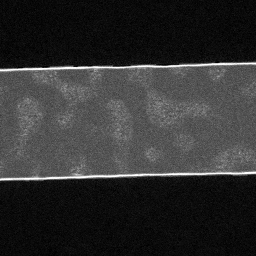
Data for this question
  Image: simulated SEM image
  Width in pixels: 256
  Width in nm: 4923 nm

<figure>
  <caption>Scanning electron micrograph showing one or a few lines or trenches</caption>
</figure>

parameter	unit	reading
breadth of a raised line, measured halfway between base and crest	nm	2110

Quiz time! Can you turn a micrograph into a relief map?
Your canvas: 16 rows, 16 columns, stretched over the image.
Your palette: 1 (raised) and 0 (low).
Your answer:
0000000000000000
0000000000000000
0000000000000000
0000000000000000
1111111111111111
1111111111111111
1111111111111111
1111111111111111
1111111111111111
1111111111111111
1111111111111111
0000000000000000
0000000000000000
0000000000000000
0000000000000000
0000000000000000